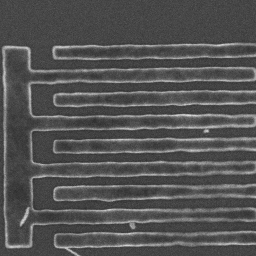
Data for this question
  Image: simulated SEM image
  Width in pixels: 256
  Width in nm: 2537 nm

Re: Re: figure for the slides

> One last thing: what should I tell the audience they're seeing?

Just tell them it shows groups of lines, slits or small figures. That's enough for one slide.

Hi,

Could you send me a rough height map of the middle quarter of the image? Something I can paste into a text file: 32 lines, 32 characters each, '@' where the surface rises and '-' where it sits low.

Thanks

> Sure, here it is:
--------------------------------
----------@@@@@@@@@@@@@@@@@@@@@@
@@@@@@@@@@@@@@@@@@@@@@@@@@@@@@@@
@@@@@@@@@@@@@@@@@@@@@@@@@@@@@@@@
@@-----@---@@@@@@@@@@@------@@--
--------------------------------
--------------------------------
@-@@@@@@@@@@@@@@@@@@@@@@@@@@@@@@
@@@@@@@@@@@@@@@@@@@@@@@@@@@@@@@@
@@@@@@@@@@@@@@@@@@@@@@@@@@@@@@@@
--@@----------------------------
--------------------------------
--------------------------------
@@@@@@@@@@@@@@@@@@@@@@@@@@@@@@@@
@@@@@@@@@@@@@@@@@@@@@@@@@@@@@@@@
@@@@@@@@@@@@@@@@@@@@@@@@@@@@@@@@
@-------------------------------
--------------------------------
--------------------------------
@@@@@@@@@@@@@@@@@@@@@@@@@@@@@@@@
@@@@@@@@@@@@@@@@@@@@@@@@@@@@@@@@
@@@@@@@@@@@@@@@@@@@@@@@@@@@@--@@
--------------------------------
--------------------------------
-----------------------@@-------
@@@@@@@@@@@@@@@@@@@@@@@@@@@@@@@@
@@@@@@@@@@@@@@@@@@@@@@@@@@@@@@@@
@@@@@@@@@@@@@@@@@@@@@@@@@@@@@@-@
--------------------------------
--------------------------------
--------------------------------
@@@@@@@@@@@@@@@@@@@@@@@@@@@@@@@@